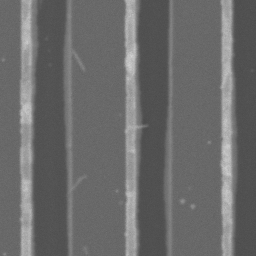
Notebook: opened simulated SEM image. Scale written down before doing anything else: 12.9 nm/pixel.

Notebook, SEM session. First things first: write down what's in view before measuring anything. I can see lines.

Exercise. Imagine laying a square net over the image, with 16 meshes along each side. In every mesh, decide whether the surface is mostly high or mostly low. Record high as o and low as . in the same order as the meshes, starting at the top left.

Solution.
oo..ooooo..oooo.
oo..ooooo..oooo.
oo..ooooo..oooo.
oo..ooooo..oooo.
oo..ooooo..oooo.
oo..ooooo..oooo.
oo..ooooo..oooo.
oo..ooooo..oooo.
oo..ooooo..oooo.
oo..ooooo..oooo.
oo..ooooo..oooo.
oo..ooooo..oooo.
oo..ooooo..oooo.
oo..ooooo..oooo.
oo..ooooo..oooo.
oo..ooooo..oooo.